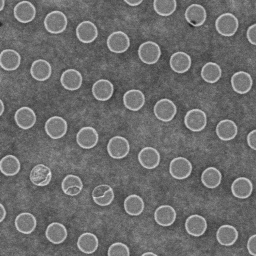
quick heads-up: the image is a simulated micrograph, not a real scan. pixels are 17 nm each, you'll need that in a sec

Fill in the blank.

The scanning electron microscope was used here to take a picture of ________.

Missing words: a regular array of raised bodies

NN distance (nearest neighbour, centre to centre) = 0.551 micrometres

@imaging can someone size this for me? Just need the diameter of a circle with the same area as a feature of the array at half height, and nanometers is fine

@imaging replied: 353